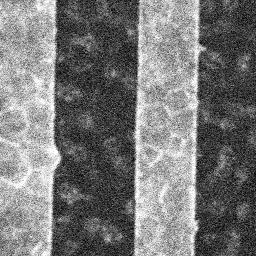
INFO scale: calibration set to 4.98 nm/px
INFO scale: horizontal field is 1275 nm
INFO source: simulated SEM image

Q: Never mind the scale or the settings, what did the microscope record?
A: one or a few lines or trenches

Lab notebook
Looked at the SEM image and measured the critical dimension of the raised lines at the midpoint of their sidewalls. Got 289 nm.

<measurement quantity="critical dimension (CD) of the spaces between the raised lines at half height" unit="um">0.424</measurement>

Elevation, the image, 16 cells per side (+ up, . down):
+++......+++....
+++......+++....
+++......+++....
+++......+++....
+++......+++....
+++......+++....
+++......+++....
+++......+++....
+++......+++....
++++.....+++....
+++......+++....
+++......+++....
+++......+++....
+++......+++....
+++......+++....
+++......+++....